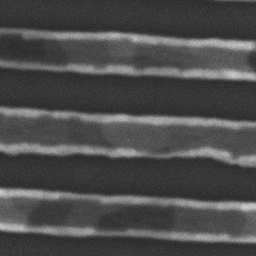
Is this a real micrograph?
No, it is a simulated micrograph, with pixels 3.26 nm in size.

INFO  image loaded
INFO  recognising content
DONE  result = one or a few lines or trenches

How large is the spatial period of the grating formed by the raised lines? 0.264 um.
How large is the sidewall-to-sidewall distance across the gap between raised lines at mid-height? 141 nanometres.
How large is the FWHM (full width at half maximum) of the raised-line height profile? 123 nanometres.